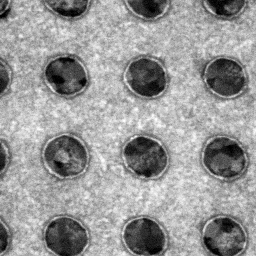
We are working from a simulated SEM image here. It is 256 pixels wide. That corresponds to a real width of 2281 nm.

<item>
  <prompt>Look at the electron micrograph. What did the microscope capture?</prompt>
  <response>raised bodies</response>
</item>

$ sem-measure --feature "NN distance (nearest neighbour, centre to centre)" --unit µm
0.707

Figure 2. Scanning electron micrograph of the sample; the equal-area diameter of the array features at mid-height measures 381 nanometres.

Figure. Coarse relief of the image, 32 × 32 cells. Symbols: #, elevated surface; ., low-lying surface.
#.....#####.....#####.....#####.
.......####......####......###..
................................
................................
................................
................................
................................
......####.......##........##...
#.....#####.....####......####..
#.....#####.....#####.....#####.
#.....#####.....#####.....#####.
#......###.......###.......###..
................................
................................
................................
................................
................................
......####......###.......###...
#.....#####....#####......####..
#....######....######....######.
#.....#####.....#####....######.
......####.......###......####..
............................#...
................................
................................
................................
................................
......###........##........##...
#.....#####.....####......####..
#.....#####....######....######.
#.....#####.....#####.....#####.
.......###.......###......####..